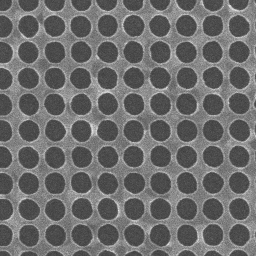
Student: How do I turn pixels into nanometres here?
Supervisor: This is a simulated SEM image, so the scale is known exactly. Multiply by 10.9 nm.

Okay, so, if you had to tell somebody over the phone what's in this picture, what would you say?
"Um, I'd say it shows a regular array of holes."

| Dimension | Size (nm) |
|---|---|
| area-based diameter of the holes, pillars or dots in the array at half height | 234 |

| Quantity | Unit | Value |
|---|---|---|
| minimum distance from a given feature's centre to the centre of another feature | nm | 281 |